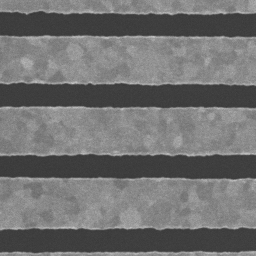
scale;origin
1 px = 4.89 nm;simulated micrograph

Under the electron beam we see lines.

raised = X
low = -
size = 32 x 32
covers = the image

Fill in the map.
XXXXXXXXXXXXXXXXXXXXXXXXXXXXXXXX
--XX--XXXXXXXXXXXXXXXXXXXXXXXXXX
--------------------------------
--------------------------------
--------------------------------
XXXXXXXXXXXXXXXXXXXXXXXXXXXXXXXX
XXXXXXXXXXXXXXXXXXXXXXXXXXXXXXXX
XXXXXXXXXXXXXXXXXXXXXXXXXXXXXXXX
XXXXXXXXXXXXXXXXXXXXXXXXXXXXXXXX
XXXXXXXXXXXXXXXXXXXXXXXXXXXXXXXX
------------------XX--------XXXX
--------------------------------
--------------------------------
XXXXXXXXXXXXXXXXXXXX-XXXXXXX-XX-
XXXXXXXXXXXXXXXXXXXXXXXXXXXXXXXX
XXXXXXXXXXXXXXXXXXXXXXXXXXXXXXXX
XXXXXXXXXXXXXXXXXXXXXXXXXXXXXXXX
XXXXXXXXXXXXXXXXXXXXXXXXXXXXXXXX
XXXXXXXXXXXXXXXXXXXXXXXXXXXXXXXX
-----X------------------X-------
--------------------------------
--------------------------------
XXXXXXXXXXXXXXXXXXXXXXXXXXXXXXXX
XXXXXXXXXXXXXXXXXXXXXXXXXXXXXXXX
XXXXXXXXXXXXXXXXXXXXXXXXXXXXXXXX
XXXXXXXXXXXXXXXXXXXXXXXXXXXXXXXX
XXXXXXXXXXXXXXXXXXXXXXXXXXXXXXXX
XXXXXXXXXXXXXXXXXXXXXXXXXXXXXXXX
XXXX-XXXXXXXXXXXXX-XXXXXX-XXXX-X
--------------------------------
--------------------------------
-------------------------X----XX